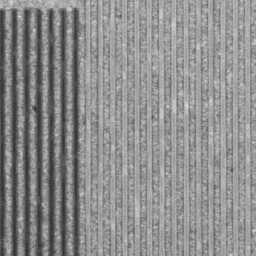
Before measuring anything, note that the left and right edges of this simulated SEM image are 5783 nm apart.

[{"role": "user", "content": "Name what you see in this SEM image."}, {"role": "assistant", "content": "parallel lines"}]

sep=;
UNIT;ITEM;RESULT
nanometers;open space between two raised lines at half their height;189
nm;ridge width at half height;87.5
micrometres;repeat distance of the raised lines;0.278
